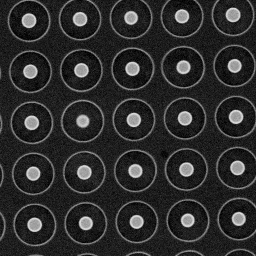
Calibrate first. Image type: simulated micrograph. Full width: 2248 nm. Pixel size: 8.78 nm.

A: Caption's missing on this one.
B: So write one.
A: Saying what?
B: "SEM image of an array of small figures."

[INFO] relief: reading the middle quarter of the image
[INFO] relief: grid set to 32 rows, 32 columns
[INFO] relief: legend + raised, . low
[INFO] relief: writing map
...+++...+++....+++...++....+++.
...+++....++....+++...+++...+++.
...+++...+++....++....+++.......
.........++++.........+++.......
........+++++........+++++......
+.......++++++......++++++++....
+++...++++++++++++++++++++++++++
++++++++++++++++++++++++++++++++
++++++++++++++++++++++++++++++.+
+++...+++++++++.....+++++++.....
+.......++++++.......+++++......
.........++++.........++++......
.........++++....+....+++....++.
....++....++....+++....++....+++
...+++....++....+++....++....+++
..........+++....+....++++......
.........++++.........++++......
+........+++++.......++++++.....
++......+++++++.....+++++++++..+
++++++++++++++++++++++++++++++++
++++++++++++++++++++++++++++++++
+++++++++++++++++++++++++++++...
+++.....+++++++......++++++.....
++.......+++++........++++......
+........++++..........+++......
.....+....+++....++....++....+++
....+++...+++...+++....++....+++
...++++...+++....++....+++...+++
....++....+++..........+++......
+.........++++........+++++.....
+........++++++......+++++++....
+++.....++++++++...+++++++++++++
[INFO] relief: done